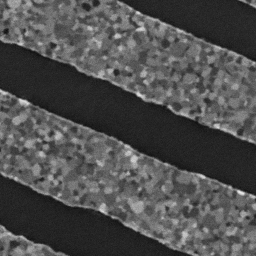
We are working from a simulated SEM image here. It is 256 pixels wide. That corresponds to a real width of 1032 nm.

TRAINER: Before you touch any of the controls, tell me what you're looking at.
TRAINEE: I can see one or a few lines or trenches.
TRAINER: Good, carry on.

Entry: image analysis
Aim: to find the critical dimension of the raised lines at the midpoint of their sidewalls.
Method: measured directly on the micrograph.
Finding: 302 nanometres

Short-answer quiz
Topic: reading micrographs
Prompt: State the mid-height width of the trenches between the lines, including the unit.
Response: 206 nm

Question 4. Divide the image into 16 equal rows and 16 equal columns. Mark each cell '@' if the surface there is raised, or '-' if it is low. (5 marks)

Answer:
@@@@@@@@--------
@@@@@@@@@@------
@@@@@@@@@@@@@---
---@@@@@@@@@@@@-
-----@@@@@@@@@@@
--------@@@@@@@@
@@--------@@@@@@
@@@@--------@@@@
@@@@@@@--------@
@@@@@@@@@-------
@@@@@@@@@@@-----
--@@@@@@@@@@@@--
----@@@@@@@@@@@@
-------@@@@@@@@@
@--------@@@@@@@
@@@--------@@@@@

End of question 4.